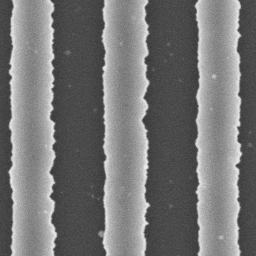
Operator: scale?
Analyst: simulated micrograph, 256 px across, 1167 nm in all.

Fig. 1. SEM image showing lines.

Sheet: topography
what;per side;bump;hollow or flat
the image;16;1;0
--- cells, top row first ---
0110001110001110
0110000110001110
0110001110001110
0110000110001110
0110001110001110
0110001110001110
0110001110001110
0110000110001110
0110000110001110
0110000110001110
0110000110001110
0110000110001110
0110001110001110
0110000110001110
0110000110001110
0110000110001110